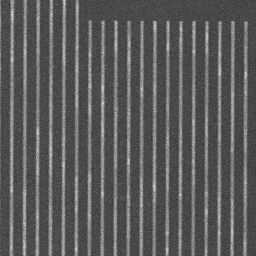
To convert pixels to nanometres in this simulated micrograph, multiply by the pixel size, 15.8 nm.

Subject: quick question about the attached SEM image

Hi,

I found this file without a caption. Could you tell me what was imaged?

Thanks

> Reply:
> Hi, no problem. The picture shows parallel lines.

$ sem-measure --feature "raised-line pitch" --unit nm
205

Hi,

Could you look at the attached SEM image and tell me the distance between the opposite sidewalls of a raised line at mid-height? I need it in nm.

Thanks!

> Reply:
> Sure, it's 39.6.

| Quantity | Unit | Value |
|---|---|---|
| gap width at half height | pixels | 10.7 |